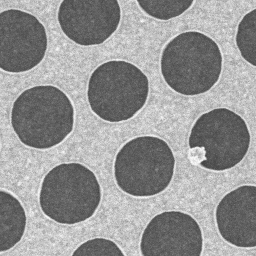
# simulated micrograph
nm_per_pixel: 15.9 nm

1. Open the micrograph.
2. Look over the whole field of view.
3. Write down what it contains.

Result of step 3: holes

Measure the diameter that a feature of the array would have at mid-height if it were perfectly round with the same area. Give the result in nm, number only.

979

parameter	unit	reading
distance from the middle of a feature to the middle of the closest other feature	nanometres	1260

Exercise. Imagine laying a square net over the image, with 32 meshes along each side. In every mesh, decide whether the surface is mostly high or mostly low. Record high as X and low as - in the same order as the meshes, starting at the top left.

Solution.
XXXXXXXX-------XX-------XXXXXXXX
---XXXX--------XXX-----XXXXXXXX-
-----XX--------XXXXX-XXXXXXXXX--
------XX-------XXXXXXXXXXXXXXX--
------XX------XXXXXXXX----XXX---
------XXXX--XXXXXXXXX------XXX--
------XXXXXXXXXXXXXX--------XX--
-----XXXXXXXXXXXXXXX--------XXX-
----XXXXXXXX-----XXX--------XXXX
XXXXXXXXXXX-------XX-------XXXXX
XXXXXXXXXXX--------XX------XXXXX
XXX-----XXX--------XXX----XXXXXX
XX-------XX-------XXXXXXXXXXXXXX
XX-------XX-------XXXXXXXXXXXXXX
X--------XXX-----XXXXXXXX-----XX
X--------XXXXXXXXXXXXXXX-------X
XX-------XXXXXXXXXXXXXXX-------X
XXX-----XXXXXXXX----XXXX-------X
XXXX--XXXXXXXXX------XXXX------X
XXXXXXXXXXXXXXX-------XXXX-----X
XXXXXXXX--XXXX--------XXX-----XX
XXXXXX------XX--------XXXXXXXXXX
XXXXX-------XX-------XXXXXXXXXXX
XXXXX--------XX------XXXXXXXXX--
--XXX--------XXXX--XXXXXXXXX----
---XX-------XXXXXXXXXXXXXXX-----
---XX-------XXXXXXXXX--XXXX-----
---XXXX----XXXXXXXX-----XXX-----
---XXXXXXXXXXXXXXX-------XX-----
---XXXXXXXXXXXXXXX-------XXX----
--XXXXXXXX----XXXX-------XXXX---
XXXXXXXXX------XXX-------XXXXXXX